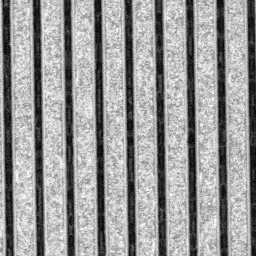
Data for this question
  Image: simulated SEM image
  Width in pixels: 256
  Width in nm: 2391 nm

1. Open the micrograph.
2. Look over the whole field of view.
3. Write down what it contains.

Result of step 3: parallel lines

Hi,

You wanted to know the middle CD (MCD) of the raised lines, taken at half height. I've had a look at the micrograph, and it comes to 0.193 um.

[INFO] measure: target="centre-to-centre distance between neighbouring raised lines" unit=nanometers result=286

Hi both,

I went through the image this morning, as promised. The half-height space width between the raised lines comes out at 91.1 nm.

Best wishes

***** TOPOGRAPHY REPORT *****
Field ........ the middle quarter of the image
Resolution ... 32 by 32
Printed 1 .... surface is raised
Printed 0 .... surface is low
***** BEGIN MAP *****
00011110001111100011111001111100
00011110001111100011111001111100
00011110001111100011111001111100
00011110001111100011111001111100
00111110001111100011111001111100
00011110001111100011111001111100
00111110001111100011111001111100
00111111001111100011111001111100
00011111001111100011111001111100
00011111001111100011111001111110
00011111001111100011111001111110
00011111001111100011111001111110
00111111001111100011111001111110
00011111001111100011111001111110
00011111001111100011111001111110
00011111001111100011111001111110
00011111001111100011111000111110
00011111001111100011111000111110
00011111001111100011111000111100
00011111001111100011111000111100
00011111001111100011111000111110
00011111001111100011111000111110
00011111001111100011111000111110
00011111001111100011111000111110
00011111001111100011111000111110
00011111001111100011111000111110
00011111001111100011111000111110
00011111000111100011111000111110
00011111000111100011111000111110
00011111000111100011111000111110
00011111000111100011111000111110
00011111001111100011111000111110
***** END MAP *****